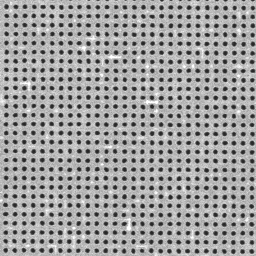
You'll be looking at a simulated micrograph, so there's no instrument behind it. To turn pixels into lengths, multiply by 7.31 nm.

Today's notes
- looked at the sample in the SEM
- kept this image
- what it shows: a regular array of holes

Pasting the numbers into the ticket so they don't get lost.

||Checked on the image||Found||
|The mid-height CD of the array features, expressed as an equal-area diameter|35.9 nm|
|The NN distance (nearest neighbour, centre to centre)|0.0639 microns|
